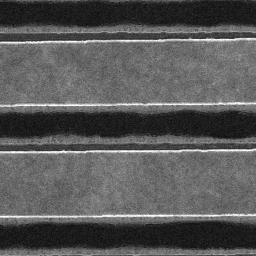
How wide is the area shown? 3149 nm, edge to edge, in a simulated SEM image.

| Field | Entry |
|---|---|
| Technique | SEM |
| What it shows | lines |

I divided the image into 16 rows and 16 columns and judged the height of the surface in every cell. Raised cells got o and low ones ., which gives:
................
................
oooooooooooooooo
oooooooooooooooo
oooooooooooooooo
oooooooooooooooo
oooooooooooooooo
................
................
oooooooooooooooo
oooooooooooooooo
oooooooooooooooo
oooooooooooooooo
oooooooooooooooo
................
................